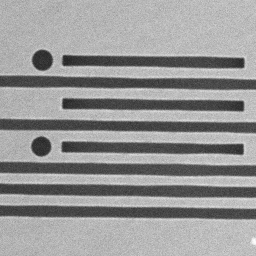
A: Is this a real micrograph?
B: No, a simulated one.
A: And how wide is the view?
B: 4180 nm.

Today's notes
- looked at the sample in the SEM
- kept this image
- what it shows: groups of lines, slits or small figures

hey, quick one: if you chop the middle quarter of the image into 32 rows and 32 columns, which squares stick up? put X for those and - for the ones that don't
--------------------------------
XXXXXXXXXXXXXXXXXXXXXXXXXXXXXXXX
XXXXXXXXXXXXXXXXXXXXXXXXXXXXXXXX
--------------------------------
--------------------------------
--------------------------------
XXXXXXXXXXXXXXXXXXXXXXXXXXXXXXXX
XXXXXXXXXXXXXXXXXXXXXXXXXXXXXXXX
--XXXXXXXXXXXXXXXXXXXXXXXXXXXXXX
--------------------------------
--------------------------------
--------------------------------
XXXXXXXXXXXXXXXXXXXXXXXXXXXXXXXX
XXXXXXXXXXXXXXXXXXXXXXXXXXXXXXXX
--------------------------------
--------------------------------
--------------------------------
XXXXXXXXXXXXXXXXXXXXXXXXXXXXXXXX
XXXXXXXXXXXXXXXXXXXXXXXXXXXXXXXX
----------------------XXXXXXXXXX
--------------------------------
--------------------------------
XXXXXXXXXXXXXX------------------
XXXXXXXXXXXXXXXXXXXXXXXXXXXXXXXX
--------XXXXXXXXXXXXXXXXXXXXXXXX
--------------------------------
--------------------------------
--------------------------------
XXXXXXXXXXXXXXXXXXXXXXXXXXXXXXXX
XXXXXXXXXXXXXXXXXXXXXXXXXXXXXXXX
--------------------------------
--------------------------------